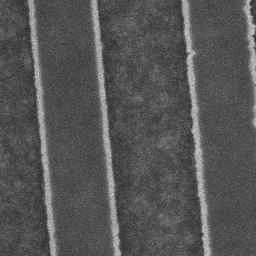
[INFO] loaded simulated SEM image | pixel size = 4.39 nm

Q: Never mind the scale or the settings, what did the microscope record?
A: one or a few lines or trenches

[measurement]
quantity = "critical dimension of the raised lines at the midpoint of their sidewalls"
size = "0.281 µm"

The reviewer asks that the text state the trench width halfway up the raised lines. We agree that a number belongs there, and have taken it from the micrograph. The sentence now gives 392 nanometres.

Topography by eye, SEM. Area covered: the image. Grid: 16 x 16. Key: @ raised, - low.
--@@@@------@@@@
--@@@@------@@@@
--@@@@------@@@@
--@@@@------@@@@
--@@@@------@@@@
--@@@@------@@@@
--@@@@@-----@@@@
---@@@@-----@@@@
---@@@@-----@@@@
---@@@@-----@@@@
---@@@@-----@@@@
---@@@@------@@@
---@@@@------@@@
---@@@@------@@@
---@@@@------@@@
---@@@@------@@@